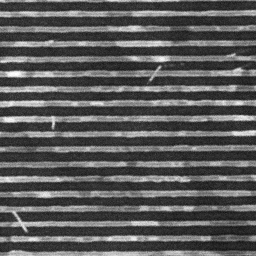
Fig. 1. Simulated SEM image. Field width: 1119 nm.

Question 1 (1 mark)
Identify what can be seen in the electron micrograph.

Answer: parallel lines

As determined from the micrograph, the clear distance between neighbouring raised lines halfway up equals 0.0475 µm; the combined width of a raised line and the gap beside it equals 65.5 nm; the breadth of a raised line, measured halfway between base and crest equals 19.7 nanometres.